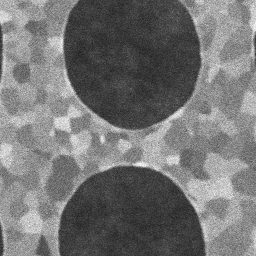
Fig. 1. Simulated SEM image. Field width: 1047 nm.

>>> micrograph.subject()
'holes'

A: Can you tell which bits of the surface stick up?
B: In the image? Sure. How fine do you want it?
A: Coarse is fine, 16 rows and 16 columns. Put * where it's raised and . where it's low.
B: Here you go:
*****.......****
****........****
****........****
****.........***
****.........***
*****.......****
*****.......****
******....******
****************
****************
*******...******
*****......*****
****........****
****........****
****.........***
****.........***